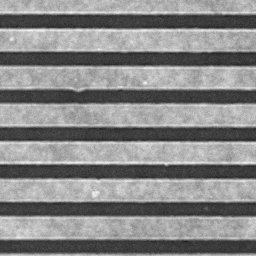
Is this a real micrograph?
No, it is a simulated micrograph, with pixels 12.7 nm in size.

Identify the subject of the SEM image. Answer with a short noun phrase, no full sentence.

parallel lines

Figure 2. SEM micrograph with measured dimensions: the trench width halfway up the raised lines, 198 nanometers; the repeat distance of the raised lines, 0.476 microns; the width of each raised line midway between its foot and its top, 0.274 um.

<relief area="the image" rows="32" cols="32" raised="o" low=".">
oooooooooooooooooooooooooooooooo
oooooooooooooooooooooooooooooooo
................................
................................
oooooooooooooooooooooooooooooooo
oooooooooooooooooooooooooooooooo
................................
................................
oooooooooooooooooooooooooooooooo
oooooooooooooooooooooooooooooooo
oooooooooooooooooooooooooooooooo
................................
................................
oooooooooooooooooooooooooooooooo
oooooooooooooooooooooooooooooooo
oooooooooooooooooooooooooooooooo
................................
................................
oooooooooooooooooooooooooooooooo
oooooooooooooooooooooooooooooooo
................................
................................
...oo.ooo.oooo..oooooo.ooooooooo
oooooooooooooooooooooooooooooooo
oooooooooooooooooooooooooooooooo
................................
................................
oooooooooooooooooooooooooooooooo
oooooooooooooooooooooooooooooooo
oooooooooooooooooooooooooooooooo
................................
................................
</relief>